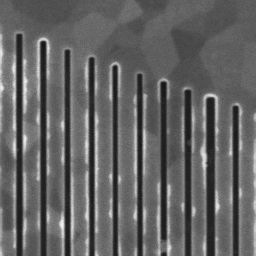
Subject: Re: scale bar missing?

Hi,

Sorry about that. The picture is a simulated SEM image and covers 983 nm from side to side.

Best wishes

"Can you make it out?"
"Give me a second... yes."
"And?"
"parallel lines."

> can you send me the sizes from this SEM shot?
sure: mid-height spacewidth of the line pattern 26.4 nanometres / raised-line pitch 0.0921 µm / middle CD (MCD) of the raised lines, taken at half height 0.0662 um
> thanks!